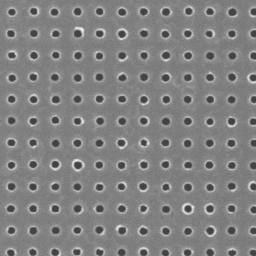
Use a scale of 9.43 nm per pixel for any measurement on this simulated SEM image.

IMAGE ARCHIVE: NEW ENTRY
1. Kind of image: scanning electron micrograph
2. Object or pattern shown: a regular array of holes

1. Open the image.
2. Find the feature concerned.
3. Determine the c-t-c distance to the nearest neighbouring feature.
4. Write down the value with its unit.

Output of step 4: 0.202 microns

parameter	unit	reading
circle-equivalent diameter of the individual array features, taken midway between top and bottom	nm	72.2